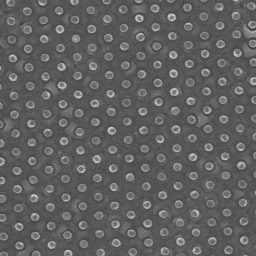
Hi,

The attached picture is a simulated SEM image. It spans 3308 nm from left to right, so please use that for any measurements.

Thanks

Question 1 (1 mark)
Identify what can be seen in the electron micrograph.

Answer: a regular array of raised bodies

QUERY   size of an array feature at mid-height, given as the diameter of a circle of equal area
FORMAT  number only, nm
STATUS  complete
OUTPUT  102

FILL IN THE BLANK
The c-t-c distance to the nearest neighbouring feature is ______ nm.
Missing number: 236